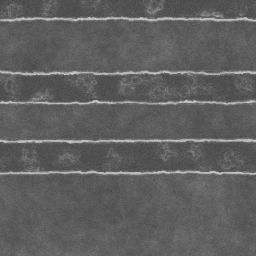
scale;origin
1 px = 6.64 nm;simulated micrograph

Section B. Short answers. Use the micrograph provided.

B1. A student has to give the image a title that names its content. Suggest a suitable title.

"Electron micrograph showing one or a few lines or trenches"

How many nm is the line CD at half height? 209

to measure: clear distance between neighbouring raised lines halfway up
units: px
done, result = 45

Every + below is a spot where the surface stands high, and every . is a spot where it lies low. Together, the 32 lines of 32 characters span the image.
++++++++++++++++++++++++++++++++
++++++++++++++++++++++++++++++++
.+.........................++..+
................................
................................
................................
................................
................................
................................
++++++++++++++++++++++++++++++++
++++++++++++++++++++++++++++++++
++++++++++++++++++++++++++++++++
++++++++++++++++++++++++++++++++
................................
................................
................................
................................
................................
++++++++++++++++++++++++++++++++
++++++++++++++++++++++++++++++++
++++++++++++++++++++++++++++++++
+++++++++.++++++++++++++++++++++
................................
................................
................................
................................
................................
................................
................................
................................
................................
................................